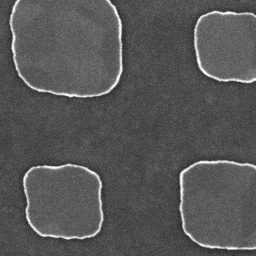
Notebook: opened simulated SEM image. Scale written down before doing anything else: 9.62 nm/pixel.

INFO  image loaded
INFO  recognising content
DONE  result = raised bodies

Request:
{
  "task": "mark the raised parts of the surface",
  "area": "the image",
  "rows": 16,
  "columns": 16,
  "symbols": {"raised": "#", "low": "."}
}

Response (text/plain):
.######.........
.#######....####
.#######....####
.#######....####
.#######.....###
..#####.........
................
................
................
................
..###.......####
..####.....#####
..####.....#####
..####.....#####
..####......####
.............###